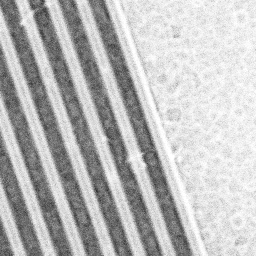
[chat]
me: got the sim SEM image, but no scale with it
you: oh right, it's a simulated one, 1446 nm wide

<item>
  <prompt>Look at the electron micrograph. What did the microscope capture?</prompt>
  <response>parallel lines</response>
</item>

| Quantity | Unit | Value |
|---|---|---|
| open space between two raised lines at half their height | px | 17.4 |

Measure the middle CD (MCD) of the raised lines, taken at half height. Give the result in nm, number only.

62.1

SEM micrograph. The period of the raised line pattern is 28.2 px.